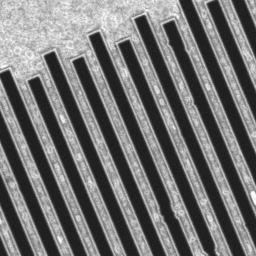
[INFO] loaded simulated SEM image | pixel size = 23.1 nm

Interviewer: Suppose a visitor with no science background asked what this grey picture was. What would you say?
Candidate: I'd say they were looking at parallel lines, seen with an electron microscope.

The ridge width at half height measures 331 nanometres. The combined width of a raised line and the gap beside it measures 563 nanometres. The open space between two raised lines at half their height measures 232 nm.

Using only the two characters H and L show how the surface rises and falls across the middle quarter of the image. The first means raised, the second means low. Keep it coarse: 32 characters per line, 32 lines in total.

LLHHHHLLLHHHHLLLHHHLLLHHHHLLLHHH
LLLHHHHLLHHHHLLLHHHHLLLHHHLLLHHH
LLLHHHHLLLHHHHLLHHHHLLLHHHHLLLHH
HLLHHHHLLLHHHHLLLHHHHLLHHHHLLLHH
HLLLHHHHLLLHHHLLLHHHHLLLHHHHLLHH
HHLLHHHHLLLHHHHLLLHHHLLLHHHHLLLH
HHLLLHHHHLLHHHHLLLHHHHLLLHHHLLLH
HHLLLHHHHLLLHHHHLLHHHHLLLHHHHLLL
HHHLLHHHHLLLHHHHLLLHHHHLLHHHHLLL
HHHLLLHHHHLLLHHHLLLHHHHLLLHHHHLL
HHHHLLHHHHLLLHHHHLLLHHHLLLHHHHLL
HHHHLLLHHHHLLHHHHLLLHHHHLLLHHHLL
LHHHHLLHHHHLLLHHHHLLLHHHLLLHHHHL
LHHHHLLLHHHHLLHHHHLLLHHHHLLLHHHL
LHHHHLLLHHHHLLLHHHHLLHHHHLLLHHHH
LLHHHHLLHHHHLLLHHHHLLLHHHHLLHHHH
LLHHHHLLLHHHHLLLHHHLLLHHHHLLLHHH
LLLHHHHLLHHHHLLLHHHHLLLHHHLLLHHH
LLLHHHHLLLHHHHLLHHHHLLLHHHHLLHHH
HLLHHHHLLLHHHHLLLHHHHLLHHHHLLLHH
HLLLHHHHLLHHHHLLLHHHHLLLHHHHLLHH
HHLLHHHHLLLHHHHLLLHHHLLLHHHHLLLH
HHLLLHHHHLLHHHHLLLHHHHLLLHHHLLLH
HHHLLHHHHLLLHHHHLLLHHHLLLHHHHLLL
HHHLLLHHHHLLHHHHLLLHHHHLLLHHHLLL
HHHLLLHHHHLLLHHHHLLHHHHLLLHHHHLL
HHHHLLHHHHLLLHHHHLLLHHHHLLHHHHLL
HHHHLLLHHHHLLHHHHLLLHHHHLLLHHHHL
LHHHHLLHHHHLLLHHHHLLLHHHLLLHHHHL
LHHHHLLLHHHHLLHHHHLLLHHHHLLLHHHL
LHHHHLLLHHHHLLLHHHHLLHHHHLLLHHHH
LLHHHHLLHHHHLLLHHHHLLLHHHHLLHHHH